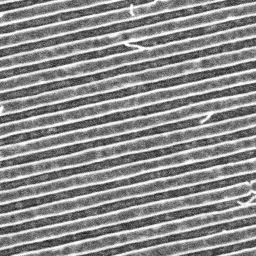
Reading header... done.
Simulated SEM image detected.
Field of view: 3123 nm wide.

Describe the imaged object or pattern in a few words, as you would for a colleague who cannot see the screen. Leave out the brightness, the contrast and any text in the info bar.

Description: parallel lines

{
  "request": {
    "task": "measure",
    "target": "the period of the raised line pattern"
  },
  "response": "266 nm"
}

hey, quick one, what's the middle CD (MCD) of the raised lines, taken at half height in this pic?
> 146 nanometres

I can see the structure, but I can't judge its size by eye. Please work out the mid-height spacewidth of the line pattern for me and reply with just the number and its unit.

0.115 um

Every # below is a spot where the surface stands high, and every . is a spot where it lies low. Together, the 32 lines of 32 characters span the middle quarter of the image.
##############............######
###########..........###########
######...........#############..
#...........##############......
........#############...........
....#############............###
#############..........#########
#######.............############
###............##############...
..........##############........
.....###############...........#
.##############............#####
##########.............#########
#######...........##############
##............#############.....
.........##############.........
....###############..........###
##############...........#######
#########..........#############
####...........###############..
..........################......
......################.........#
..#############.............####
############...........#######.#
#######...........##############
####..........##############....
..........############..........
....##############............##
###############..........#######
##########...........###########
#####............##############.
............##############......